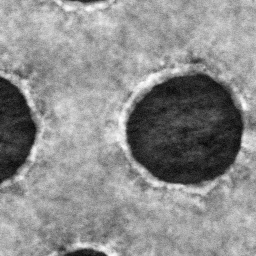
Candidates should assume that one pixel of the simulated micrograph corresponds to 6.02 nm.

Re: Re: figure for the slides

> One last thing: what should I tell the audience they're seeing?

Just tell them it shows holes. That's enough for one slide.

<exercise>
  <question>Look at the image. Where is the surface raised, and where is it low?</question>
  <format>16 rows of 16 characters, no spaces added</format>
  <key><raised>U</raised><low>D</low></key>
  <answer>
UUUUUUUUUUUUUUUU
UUUUUUUUUUUUUUUU
UUUUUUUUUUUUUUUU
UUUUUUUUUUUUUUUU
UUUUUUUUUUUDDUUU
DUUUUUUUUDDDDDUU
DDUUUUUUDDDDDDDU
DDUUUUUUDDDDDDDU
DDUUUUUUDDDDDDDU
DDUUUUUUDDDDDDDU
DUUUUUUUUDDDDDUU
UUUUUUUUUUUDDUUU
UUUUUUUUUUUUUUUU
UUUUUUUUUUUUUUUU
UUUUUUUUUUUUUUUU
UUUUUUUUUUUUUUUU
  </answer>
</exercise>